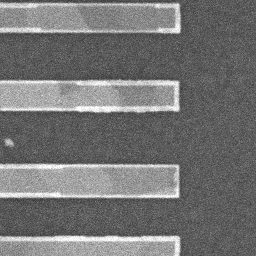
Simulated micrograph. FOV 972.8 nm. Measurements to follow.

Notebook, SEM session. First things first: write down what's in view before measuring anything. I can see one or a few lines or trenches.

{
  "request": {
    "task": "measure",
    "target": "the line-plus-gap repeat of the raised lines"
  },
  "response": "310 nm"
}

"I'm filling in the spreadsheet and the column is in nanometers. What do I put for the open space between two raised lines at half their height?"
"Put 186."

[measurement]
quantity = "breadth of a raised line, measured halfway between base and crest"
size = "114 nanometres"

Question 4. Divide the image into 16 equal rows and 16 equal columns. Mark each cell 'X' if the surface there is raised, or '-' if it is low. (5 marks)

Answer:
XXXXXXXXXXX-----
XXXXXXXXXXX-----
----------------
----------------
----------------
XXXXXXXXXXX-----
XXXXXXXXXXX-----
----------------
----------------
----------------
XXXXXXXXXXX-----
XXXXXXXXXXX-----
----------------
----------------
----------------
XXXXXXXXXXX-----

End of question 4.